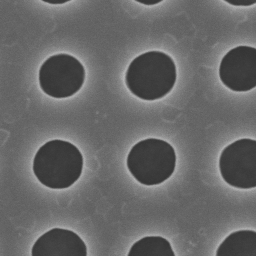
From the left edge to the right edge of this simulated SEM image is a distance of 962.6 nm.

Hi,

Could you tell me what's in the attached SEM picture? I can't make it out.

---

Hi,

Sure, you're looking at holes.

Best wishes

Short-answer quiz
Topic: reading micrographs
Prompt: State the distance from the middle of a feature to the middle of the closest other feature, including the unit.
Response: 327 nm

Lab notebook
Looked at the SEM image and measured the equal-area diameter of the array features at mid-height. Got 182 nm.